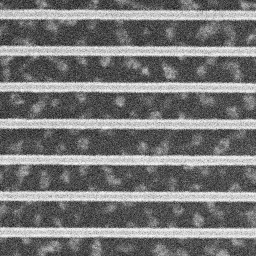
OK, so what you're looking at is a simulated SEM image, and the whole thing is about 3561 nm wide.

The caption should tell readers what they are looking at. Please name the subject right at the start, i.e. parallel lines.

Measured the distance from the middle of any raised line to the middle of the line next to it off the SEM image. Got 36.3 px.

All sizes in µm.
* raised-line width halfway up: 0.101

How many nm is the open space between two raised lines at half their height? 402